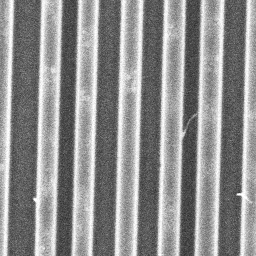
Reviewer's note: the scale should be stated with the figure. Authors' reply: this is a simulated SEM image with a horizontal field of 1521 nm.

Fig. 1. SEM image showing parallel lines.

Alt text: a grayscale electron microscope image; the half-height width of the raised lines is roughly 117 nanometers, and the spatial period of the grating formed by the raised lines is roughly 0.239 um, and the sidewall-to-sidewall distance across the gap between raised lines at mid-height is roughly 23.9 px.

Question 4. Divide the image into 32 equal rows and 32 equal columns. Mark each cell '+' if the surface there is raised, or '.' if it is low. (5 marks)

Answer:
++...+++..++...+++...++..+++...+
++...+++..++...+++...++..+++...+
++...+++..++...+++...++..+++...+
++...++...++...+++...++..+++...+
+....++...++...+++...++..+++...+
+....++...++...+++..+++..+++...+
+....++...++...+++..+++..+++...+
+....++...++...+++..+++..+++...+
+....++...++...++...+++..+++...+
+....++...++...++...+++..+++...+
+....++...++...++...+++..+++...+
+....++...++...++...+++..+++...+
+....++...++...++...+++..+++...+
+....++...++...++...+++..+++...+
+....++...++...++...+++..++....+
+....++..+++...++...+++..++....+
+....++..+++...++...+++..++....+
+....++..+++...++...+++..++....+
+....++..+++...++...+++..++....+
+....++..+++...++...+++..++....+
+....++..+++...++...+++..++...++
+....++..+++...++...+++..++...++
+....++..+++...++...+++..++...++
+....++..+++...++...++...++...++
+....++..+++...++...++...++...++
+...+++..+++...++...++...++...++
+....++..+++...++...++...++...++
+....++..+++...++...++...++...++
+....++..++....++...++...++...++
+....++..++....++...++...++...++
+....++..++....++...++..+++...++
+....++..++....++...++..+++...++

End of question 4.